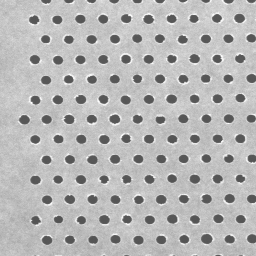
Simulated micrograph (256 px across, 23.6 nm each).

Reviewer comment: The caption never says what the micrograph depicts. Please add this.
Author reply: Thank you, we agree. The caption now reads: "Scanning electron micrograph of a regular array of holes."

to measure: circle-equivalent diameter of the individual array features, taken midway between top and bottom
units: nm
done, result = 224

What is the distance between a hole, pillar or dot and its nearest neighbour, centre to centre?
22.5 px